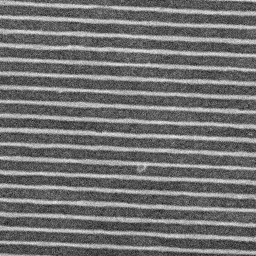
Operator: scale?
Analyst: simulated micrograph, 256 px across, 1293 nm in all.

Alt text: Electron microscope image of parallel lines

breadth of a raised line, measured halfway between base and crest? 17.7 nm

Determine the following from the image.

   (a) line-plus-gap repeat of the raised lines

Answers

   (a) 70.9 nm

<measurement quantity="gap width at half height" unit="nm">52.3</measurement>